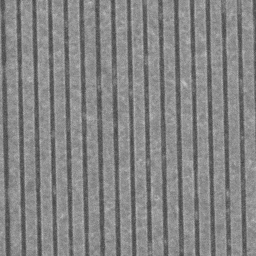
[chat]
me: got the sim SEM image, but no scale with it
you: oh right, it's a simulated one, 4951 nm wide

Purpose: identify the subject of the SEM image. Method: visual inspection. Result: parallel lines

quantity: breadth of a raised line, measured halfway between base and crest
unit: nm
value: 198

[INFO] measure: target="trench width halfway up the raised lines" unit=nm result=106